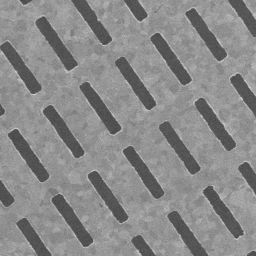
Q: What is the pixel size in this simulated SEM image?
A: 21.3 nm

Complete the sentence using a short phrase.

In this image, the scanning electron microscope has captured a regular array of holes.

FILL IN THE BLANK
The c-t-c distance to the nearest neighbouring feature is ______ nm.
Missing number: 915